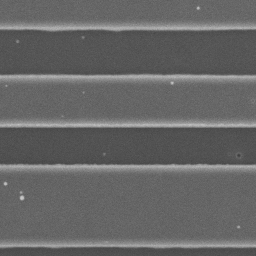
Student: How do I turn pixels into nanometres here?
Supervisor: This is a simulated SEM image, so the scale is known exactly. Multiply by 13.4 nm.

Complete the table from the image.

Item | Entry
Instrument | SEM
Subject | lines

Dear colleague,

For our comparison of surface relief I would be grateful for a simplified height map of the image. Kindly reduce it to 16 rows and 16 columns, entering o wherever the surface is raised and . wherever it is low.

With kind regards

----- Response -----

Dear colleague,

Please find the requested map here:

oooooooooooooooo
oooooooooooooooo
................
................
................
oooooooooooooooo
oooooooooooooooo
oooooooooooooooo
................
................
oooooooooooooooo
oooooooooooooooo
oooooooooooooooo
oooooooooooooooo
oooooooooooooooo
................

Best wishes